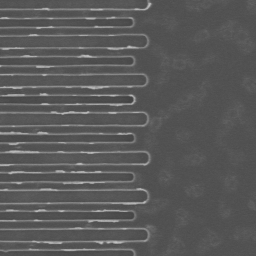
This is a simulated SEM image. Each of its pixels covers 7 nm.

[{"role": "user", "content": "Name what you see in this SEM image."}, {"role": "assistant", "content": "parallel lines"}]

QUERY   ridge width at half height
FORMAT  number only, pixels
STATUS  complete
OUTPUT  9.11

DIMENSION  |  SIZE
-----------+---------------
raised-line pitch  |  135 nanometers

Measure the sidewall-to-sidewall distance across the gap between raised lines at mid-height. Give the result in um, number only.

0.07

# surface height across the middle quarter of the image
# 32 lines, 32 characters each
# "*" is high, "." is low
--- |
.*******************************
********************************
********************************
.....................***********
.....................***********
....................************
********************************
********************************
.................***************
.................***************
********************************
********************************
....................************
.....................***********
.....................***********
**************....**************
********************************
**......************************
..................**************
.................***************
********************************
********************************
.....................***********
.....................***********
.....................***********
********************************
********************************
.................***************
..................**************
..***.....**********************
********************************
***...****......****************